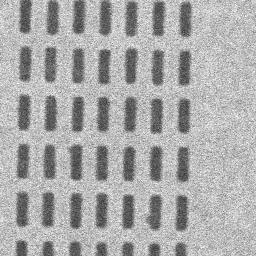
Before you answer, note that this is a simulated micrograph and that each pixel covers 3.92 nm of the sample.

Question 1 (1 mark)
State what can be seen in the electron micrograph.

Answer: a regular array of holes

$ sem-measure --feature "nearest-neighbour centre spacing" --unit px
26.4